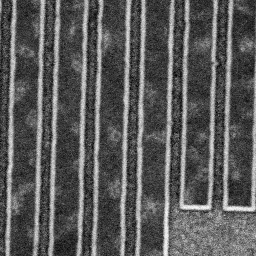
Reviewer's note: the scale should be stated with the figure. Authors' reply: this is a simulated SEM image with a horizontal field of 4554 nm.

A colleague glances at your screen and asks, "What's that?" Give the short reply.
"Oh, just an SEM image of parallel lines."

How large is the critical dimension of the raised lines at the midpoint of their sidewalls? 29.1 pixels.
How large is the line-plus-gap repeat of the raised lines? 768 nanometers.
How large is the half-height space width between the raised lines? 260 nm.